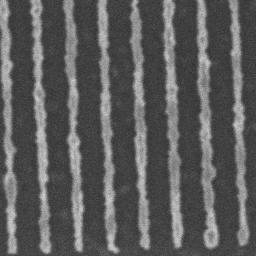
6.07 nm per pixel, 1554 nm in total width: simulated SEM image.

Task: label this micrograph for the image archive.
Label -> parallel lines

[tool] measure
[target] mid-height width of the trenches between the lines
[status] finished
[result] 158 nanometers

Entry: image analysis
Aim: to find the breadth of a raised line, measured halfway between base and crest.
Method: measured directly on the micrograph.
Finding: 45.5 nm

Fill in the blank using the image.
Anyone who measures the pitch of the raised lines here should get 0.2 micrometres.